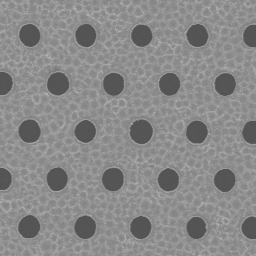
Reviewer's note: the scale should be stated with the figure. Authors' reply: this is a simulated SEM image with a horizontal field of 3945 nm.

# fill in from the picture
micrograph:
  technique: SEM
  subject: a regular array of holes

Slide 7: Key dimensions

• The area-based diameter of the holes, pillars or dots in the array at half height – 22.1 px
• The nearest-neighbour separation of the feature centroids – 851 nanometres